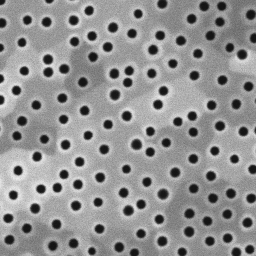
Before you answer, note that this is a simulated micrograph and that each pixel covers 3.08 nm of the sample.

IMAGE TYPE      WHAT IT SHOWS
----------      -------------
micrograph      a regular array of holes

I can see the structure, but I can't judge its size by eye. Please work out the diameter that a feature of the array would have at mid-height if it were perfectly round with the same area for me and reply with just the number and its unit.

28.6 nm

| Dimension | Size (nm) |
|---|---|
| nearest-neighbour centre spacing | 61.7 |